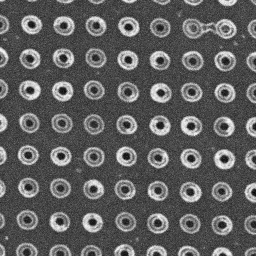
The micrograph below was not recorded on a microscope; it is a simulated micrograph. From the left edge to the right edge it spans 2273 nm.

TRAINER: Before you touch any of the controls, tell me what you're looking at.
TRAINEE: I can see a regular array of ring-shaped raised bodies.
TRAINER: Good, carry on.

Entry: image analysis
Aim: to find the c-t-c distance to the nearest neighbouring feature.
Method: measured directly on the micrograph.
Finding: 283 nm